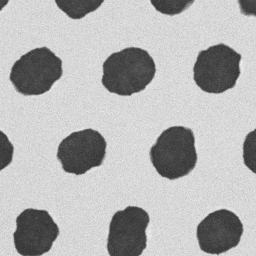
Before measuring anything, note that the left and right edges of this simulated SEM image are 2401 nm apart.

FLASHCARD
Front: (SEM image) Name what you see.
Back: holes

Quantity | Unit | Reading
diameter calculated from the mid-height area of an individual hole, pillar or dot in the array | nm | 454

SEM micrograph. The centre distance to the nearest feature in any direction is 0.852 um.